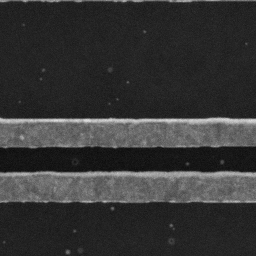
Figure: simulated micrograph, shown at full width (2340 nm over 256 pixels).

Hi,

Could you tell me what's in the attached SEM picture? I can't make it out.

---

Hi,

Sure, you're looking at lines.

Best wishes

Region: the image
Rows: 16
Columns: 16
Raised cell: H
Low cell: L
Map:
LLLLLLLLLLLLLLLL
LLLLLLLLLLLLLLLL
LLLLLLLLLLLLLLLL
LLLLLLLLLLLLLLLL
LLLLLLLLLLLLLLLL
LLLLLLLLLLLLLLLL
LLLLLLLLLLLLLLLL
HHHHHHHHHHHHHHHL
HHHHHHHHHHHHHHHH
LLLLLLLLLLLLLLLL
LLLLLLLLLLLLLLLL
HHHHHHHHHHHHHHHH
HHHHHHHHHHHHHHHH
LLLLLLLLLLLLLLLL
LLLLLLLLLLLLLLLL
LLLLLLLLLLLLLLLL